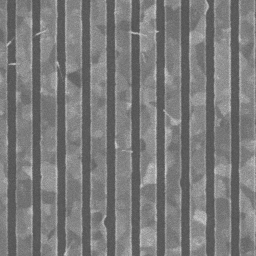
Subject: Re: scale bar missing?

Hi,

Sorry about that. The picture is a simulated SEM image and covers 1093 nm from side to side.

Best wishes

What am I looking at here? parallel lines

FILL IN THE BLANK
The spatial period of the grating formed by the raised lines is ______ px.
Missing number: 24.8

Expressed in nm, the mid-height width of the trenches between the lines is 39.5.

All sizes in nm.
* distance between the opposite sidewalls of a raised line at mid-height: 68.4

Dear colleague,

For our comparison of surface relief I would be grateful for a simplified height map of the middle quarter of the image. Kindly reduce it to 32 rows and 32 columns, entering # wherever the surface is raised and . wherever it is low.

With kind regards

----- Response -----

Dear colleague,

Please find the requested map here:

.###...####..####..####..####..#
.###...####..####..####..####...
.###...####..####..####..####...
####...####..####..####..####...
####...####..####..####..####...
.###...####..####..####..####...
####...####..####..####..####...
####...####..####..####..####..#
####...####..####..####..####..#
####...####..####..####..####..#
.###...###...####..####..####..#
.###...###...####..####..####...
.###...####..####..####..####...
.###...####..####..####..####...
.###...####..####..####..####...
.###...###...####..####..####...
.###...####..####..####..####...
.###...####..####..####..####...
.###...####..####..####..####...
.###...####..####..####..####...
.###...####..####..####..####...
.###...####..####..####..####...
.###...####..####..####..####...
####...####..####..####..####...
####...###...####..####..####...
.###...####..####..####..####...
.###...####..####..####..####...
.###...####..####..####..####...
.###...####..####..####..####...
.###...####..####..####..####...
.###...####..####..####..####...
.###...###...####..####..####...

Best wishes